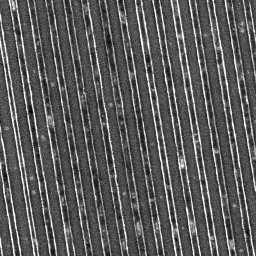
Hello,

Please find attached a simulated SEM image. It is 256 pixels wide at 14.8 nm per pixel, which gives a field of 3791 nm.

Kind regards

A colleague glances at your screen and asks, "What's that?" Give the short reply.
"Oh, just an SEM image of parallel lines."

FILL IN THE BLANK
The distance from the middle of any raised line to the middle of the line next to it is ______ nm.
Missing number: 262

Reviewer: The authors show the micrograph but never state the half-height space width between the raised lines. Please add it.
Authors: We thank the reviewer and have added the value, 176 nanometers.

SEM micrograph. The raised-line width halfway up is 6.41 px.